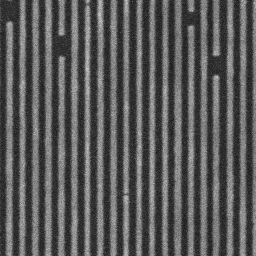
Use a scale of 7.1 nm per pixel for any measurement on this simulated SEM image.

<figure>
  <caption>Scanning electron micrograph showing parallel lines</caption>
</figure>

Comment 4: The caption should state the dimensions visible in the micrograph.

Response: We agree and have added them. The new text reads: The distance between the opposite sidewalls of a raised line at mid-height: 0.0364 microns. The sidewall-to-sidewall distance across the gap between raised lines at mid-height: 55.9 nm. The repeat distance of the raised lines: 0.0921 microns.